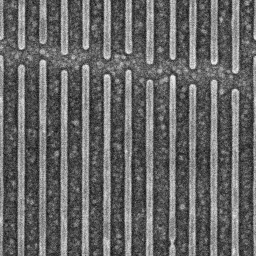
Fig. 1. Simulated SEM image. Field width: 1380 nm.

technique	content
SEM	parallel lines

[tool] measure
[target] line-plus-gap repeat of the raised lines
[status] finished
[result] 115 nm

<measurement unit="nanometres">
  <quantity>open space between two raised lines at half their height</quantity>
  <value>84.8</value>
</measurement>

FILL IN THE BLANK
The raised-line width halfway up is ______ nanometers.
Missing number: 33